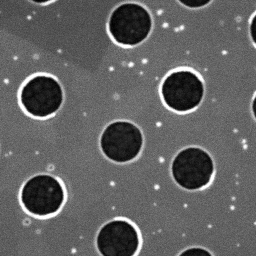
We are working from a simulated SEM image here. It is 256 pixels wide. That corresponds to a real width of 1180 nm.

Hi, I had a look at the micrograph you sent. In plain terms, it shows holes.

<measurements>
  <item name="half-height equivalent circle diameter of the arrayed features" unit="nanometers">191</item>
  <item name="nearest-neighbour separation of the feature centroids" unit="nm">376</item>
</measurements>